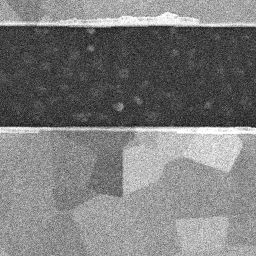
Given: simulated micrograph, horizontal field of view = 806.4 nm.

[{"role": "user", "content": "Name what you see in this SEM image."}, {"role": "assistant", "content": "one or a few lines or trenches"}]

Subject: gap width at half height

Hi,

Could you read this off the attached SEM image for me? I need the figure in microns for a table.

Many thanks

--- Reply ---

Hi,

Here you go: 0.329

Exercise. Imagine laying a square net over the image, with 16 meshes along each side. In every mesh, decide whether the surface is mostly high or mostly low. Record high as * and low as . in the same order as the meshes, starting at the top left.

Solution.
****************
....*****..*****
................
................
................
................
................
................
****************
****************
****************
****************
****************
****************
****************
****************